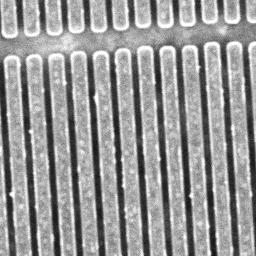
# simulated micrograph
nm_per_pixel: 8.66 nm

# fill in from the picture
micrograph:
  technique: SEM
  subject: parallel lines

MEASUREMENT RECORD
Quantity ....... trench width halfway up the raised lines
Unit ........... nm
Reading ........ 68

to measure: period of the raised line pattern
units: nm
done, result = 193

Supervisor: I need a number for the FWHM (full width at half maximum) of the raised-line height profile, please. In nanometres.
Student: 127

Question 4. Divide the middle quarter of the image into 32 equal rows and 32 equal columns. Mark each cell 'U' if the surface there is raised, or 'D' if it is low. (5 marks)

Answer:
DDUUUUDDUUUDDUUUUDDUUUDDUUUUDDUU
DDUUUUDDUUUDDUUUUDDUUUDDUUUUDDUU
DDUUUUDDUUUDDUUUUDDUUUDDUUUUDDUU
DDUUUUDDUUUDDUUUUDDUUUUDDUUUDDUU
DDUUUUDDUUUDDUUUUDDUUUUDDUUUDDUU
DDUUUUDDUUUDDDUUUDDUUUDDDUUUDDUU
DDUUUUDDUUUDDDUUUDDUUUUDDUUUDDUU
DDUUUUDDUUUDDDUUUDDUUUUDDUUUDDUU
DDUUUUDDUUUUDDUUUDDUUUUDDUUUDDUU
UDDUUUDDUUUUDDUUUDDUUUUDDUUUDDDU
UDDUUUDDUUUUDDUUUDDDUUUDDUUUDDUU
UDDUUUDDUUUUDDUUUDDUUUUDDUUUUDUU
UDDUUUDDUUUUDDUUUDDUUUUDDUUUUDDU
UDDUUUDDUUUUDDUUUUDUUUUDDUUUUDDU
UDDUUUUDUUUUDDUUUUDDUUUDDUUUUDDU
UDDUUUUDUUUUDDUUUUDDUUUDDUUUUDDU
UDDUUUUDDUUUDDUUUUDDUUUDDUUUUDDU
UDDUUUUDDUUUDDUUUUDDUUUDDUUUUDDU
UDDUUUUDDUUUDDUUUUDDUUUDDUUUUDDU
UDDUUUUDDUUUDDUUUUDDUUUDDDUUUDDU
UDDUUUUDDUUUUDUUUUDDUUUDDDUUUDDU
UDDUUUUDDUUUUDDUUUDDUUUUDDUUUDDU
UDDDUUUDDUUUUDDUUUDDUUUUDDUUUDDU
UDDDUUUDDUUUUDUUUUDDUUUUDDUUUDDU
UDDDUUUDDUUUUDDUUUDDUUUUDDUUUDDD
UUDDUUUDDUUUUDDUUUDDUUUUDDUUUDDD
UUDDUUUDDUUUUDDUUUDDDUUUDDUUUDDD
UUDDUUUDDUUUUDDUUUDDUUUUDDUUUUDD
UUDDUUUDDUUUUDDUUUDDUUUUDDUUUUDD
UUDDUUUDDUUUUDDUUUUDDUUUDDUUUUDD
UUDDUUUUDUUUUDDUUUUDDUUUDDUUUUDD
UUDDUUUUDDUUUDDUUUUDDUUUDDUUUUDD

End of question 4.